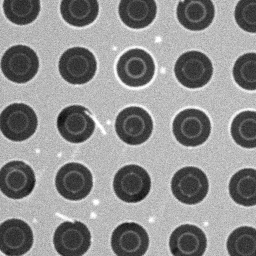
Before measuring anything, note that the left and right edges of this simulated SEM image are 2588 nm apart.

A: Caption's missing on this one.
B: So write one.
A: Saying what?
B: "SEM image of an array of small figures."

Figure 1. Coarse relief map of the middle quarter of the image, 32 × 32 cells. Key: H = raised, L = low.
LHHHHHLLHHHHHLLLHHHHLLLHHHHLLLHH
LHHHHHLLHHHHHLLLHHHHLLLHHHHLLLHH
LLHHHLLLHHHHHLLLHHHHLLLHHHHLLLHH
LLLLLLLHHHHHHLLLLLLLLLHHHHHHLLLH
LLLLLLHHHHHHHHLLLLLLLLHHHHHHLLLL
HHHHHHHHHHHHHHHLLLLLLHHHHHHHHLLL
HHHHHHHHHHHHHHHHHHHHHHHHHHHHHHHH
HHHHHHHHHHHHHHHHHHHHHHHHHHHHHHHH
HHHHHHHHHHHHHHHHHHHHHHHHHHHHHHHH
HHHHHHHHHHHHHHHHHHHHHHHHHHHHHHHH
HLLLLHHHHHHHHHHHLLLHHHHHHHHHHHHH
LLLLLLHHHHHHHHLLLLLLLHHHHHHHHLLL
LLLLLLLHHHHHHLLLLLLLLLHHHHHHLLLL
LHHHHLLHHHHHHLLLHHHLLLHHHHHLLLLL
LHHHHLLLHHHHLLLHHHHHLLLHHHHLLLHH
LHHHHLLLHHHHLLLHHHHHLLLHHHHLLLHH
LHHHHLLLHHHHHLLHHHHHLLHHHHHLLLHH
LLLLLLLHHHHHHLLLHHHLLLHHHHHLLLHH
LLLLLLHHHHHHHHLLLLLLLHHHHHHHLLLL
HLLLLHHHHHHHHHHLLLLLHHHHHHHHLLLL
HHHHHHHHHHHHHHHHHLHHHHHHHHHHHHLL
HHHHHHHHHHHHHHHHHHHHHHHHHHHHHHHH
HHHHHHHHHHHHHHHHHHHHHHHHHHHHHHHH
HHHHHHHHHHHHHHHHHHHHHHHHHHHHHHHH
HLLHHHHHHHHHHHHHHHHHHHHHHHHHHHHH
LLLLLLHHHHHHHHHLLLLHHHHHHHHHHHLL
LLLLLLLHHHHHHHLLLLLLHHHHHHHHLLLL
LHHHLLLHHHHHHLLLHHLLLHHHHHHLLLLL
HHHHHLLHHHHHLLLHHHHLLLHHHHHLLLHH
HHHHHLLHHHHHLLLHHHHLLLHHHHHLLHHH
HHHHHLLHHHHHLLLHHHHLLLHHHHHLLHHH
LHHHLLLHHHHHLLLHHHHLLLHHHHHLLHHH